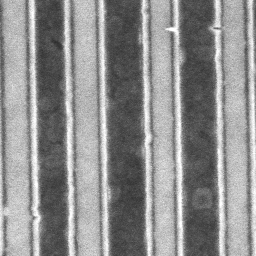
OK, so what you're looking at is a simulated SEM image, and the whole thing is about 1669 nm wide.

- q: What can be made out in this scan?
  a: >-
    one or a few lines or trenches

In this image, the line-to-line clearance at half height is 205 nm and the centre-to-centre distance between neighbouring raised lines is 481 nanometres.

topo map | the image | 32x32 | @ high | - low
----@@@@-----@@@@@----@@@@@----@
----@@@@-----@@@@@----@@@@@----@
----@@@@-----@@@@@----@@@@@----@
----@@@@-----@@@@@----@@@@@----@
----@@@@-----@@@@@----@@@@@----@
----@@@@-----@@@@@----@@@@@----@
----@@@@@----@@@@@----@@@@@----@
----@@@@@----@@@@@----@@@@@----@
----@@@@-----@@@@@----@@@@@----@
----@@@@@----@@@@@----@@@@@----@
----@@@@@----@@@@@----@@@@@----@
----@@@@@----@@@@@----@@@@@----@
----@@@@@----@@@@@----@@@@@----@
----@@@@@----@@@@@----@@@@@-----
----@@@@@----@@@@@----@@@@@-----
----@@@@@----@@@@@----@@@@@-----
----@@@@@----@@@@@----@@@@@-----
----@@@@@----@@@@@@---@@@@@@----
----@@@@@----@@@@@----@@@@@@----
----@@@@@----@@@@@@---@@@@@@----
----@@@@@----@@@@@@---@@@@@@----
----@@@@@----@@@@@@---@@@@@@----
----@@@@@----@@@@@@---@@@@@@----
----@@@@@----@@@@@@---@@@@@@----
----@@@@@----@@@@@@---@@@@@@----
----@@@@@----@@@@@@---@@@@@@----
----@@@@@----@@@@@@---@@@@@@----
-----@@@@----@@@@@@----@@@@@----
----@@@@@----@@@@@@----@@@@@----
----@@@@@----@@@@@@----@@@@@----
----@@@@@----@@@@@@---@@@@@@----
-----@@@@----@@@@@@---@@@@@@----